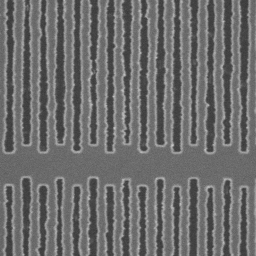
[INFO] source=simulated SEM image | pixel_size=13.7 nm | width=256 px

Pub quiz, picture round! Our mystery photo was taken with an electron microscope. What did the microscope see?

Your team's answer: parallel lines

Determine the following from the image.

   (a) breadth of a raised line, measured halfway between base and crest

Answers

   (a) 117 nm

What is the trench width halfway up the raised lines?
115 nm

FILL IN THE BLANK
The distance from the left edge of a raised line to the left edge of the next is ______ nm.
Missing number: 230